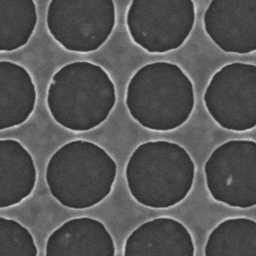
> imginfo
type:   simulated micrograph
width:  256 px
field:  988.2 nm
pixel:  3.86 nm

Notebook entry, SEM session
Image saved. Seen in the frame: holes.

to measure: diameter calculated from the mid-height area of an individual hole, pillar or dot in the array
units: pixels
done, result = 68.4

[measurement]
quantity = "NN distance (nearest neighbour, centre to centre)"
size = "0.3 micrometres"